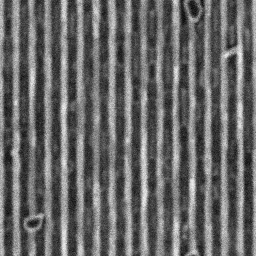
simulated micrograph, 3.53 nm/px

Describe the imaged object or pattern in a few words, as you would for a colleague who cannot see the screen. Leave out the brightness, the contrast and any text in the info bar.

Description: parallel lines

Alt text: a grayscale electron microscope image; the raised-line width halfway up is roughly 18.5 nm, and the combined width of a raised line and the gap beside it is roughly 56.5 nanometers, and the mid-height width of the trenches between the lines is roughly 37.1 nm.